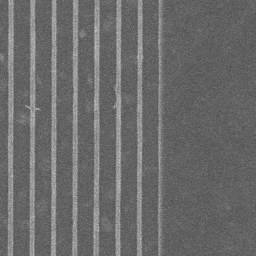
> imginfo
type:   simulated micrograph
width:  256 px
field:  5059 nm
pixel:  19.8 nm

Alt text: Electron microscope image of parallel lines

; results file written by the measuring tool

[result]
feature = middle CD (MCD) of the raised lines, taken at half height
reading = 81.5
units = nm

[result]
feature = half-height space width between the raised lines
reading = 341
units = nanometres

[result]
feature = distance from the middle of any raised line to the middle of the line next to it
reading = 425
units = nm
